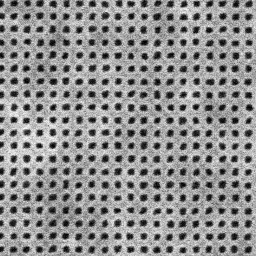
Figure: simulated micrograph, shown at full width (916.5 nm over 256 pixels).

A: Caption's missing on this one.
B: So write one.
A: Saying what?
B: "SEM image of a regular array of holes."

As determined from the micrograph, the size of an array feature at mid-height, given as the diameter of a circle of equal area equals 26.5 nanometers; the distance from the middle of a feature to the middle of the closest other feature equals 44.7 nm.